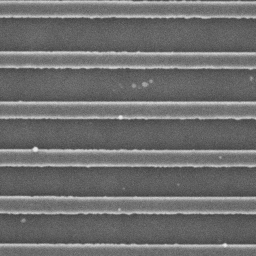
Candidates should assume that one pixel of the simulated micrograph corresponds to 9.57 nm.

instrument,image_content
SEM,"lines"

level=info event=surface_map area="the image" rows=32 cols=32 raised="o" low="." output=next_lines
oooooooooooooooooooooooooooooooo
oooooooooooooooooooooooooooooooo
................................
................................
................................
................................
................................
oooooooooooooooooooooooooooooooo
..o.oooo.ooo.oo.oooooooooooooooo
................................
................................
................................
................................
oooooooooooooooooooooooooooooooo
oooooooooooooooooooooooooooooooo
................................
................................
................................
................................
oooooooooooooooooooooooooooooooo
oooooooooooooooooooooooooooooooo
................................
................................
................................
................................
oooooooooooooooooooooooooooooooo
oooooooooooooooooooooooooooooooo
................................
................................
................................
................................
oooooooooooooooooooooooooooooooo